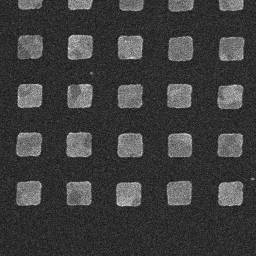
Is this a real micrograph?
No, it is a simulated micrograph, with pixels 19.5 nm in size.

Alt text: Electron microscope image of a regular array of raised bodies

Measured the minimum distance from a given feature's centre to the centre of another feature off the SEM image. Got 48.6 pixels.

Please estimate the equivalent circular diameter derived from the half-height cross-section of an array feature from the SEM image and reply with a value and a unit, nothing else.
510 nm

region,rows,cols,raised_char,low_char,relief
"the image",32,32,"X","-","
--XXX----XX----XXX---XXX---XXX--
--------------------------------
--------------------------------
--------------------------------
---XX----X----------------------
--XXX----XX----XXX---XXX---XXX--
--XXX----XX----XXX---XXX---XXX--
----------------------X-----XX--
--------------------------------
--------------------------------
--------------------------------
--XXX----XXX---XXX---XXX---XXX--
--XXX----XX----XXX---XXX---XXX--
----------------------------XX--
--------------------------------
--------------------------------
--------------------------------
--XXX---XXX----XXX---XXX---XXX--
--XXX---XXX----XXX---XXX---XXX--
---------XX----XX----XX-----XX--
--------------------------------
--------------------------------
--------------------------------
--XXX---XXX----XXX---XXX---XXX--
--XXX---XXX----XXX---XXX---XXX--
--XXX----XX----XX----XX-----XX--
--------------------------------
--------------------------------
--------------------------------
--------------------------------
--------------------------------
--------------------------------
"